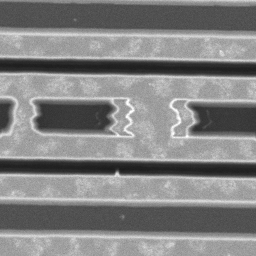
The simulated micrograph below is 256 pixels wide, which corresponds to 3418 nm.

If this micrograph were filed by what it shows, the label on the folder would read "parallel lines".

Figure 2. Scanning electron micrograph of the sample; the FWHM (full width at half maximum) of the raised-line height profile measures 397 nm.